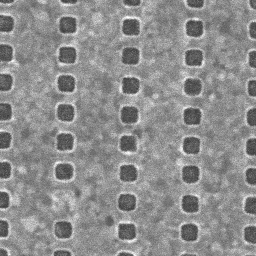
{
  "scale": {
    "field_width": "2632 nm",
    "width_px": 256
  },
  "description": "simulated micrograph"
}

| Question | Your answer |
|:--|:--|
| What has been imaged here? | a regular array of holes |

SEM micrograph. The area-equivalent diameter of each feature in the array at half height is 20.1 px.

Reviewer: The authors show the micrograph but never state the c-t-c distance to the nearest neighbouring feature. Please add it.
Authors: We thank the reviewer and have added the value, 298 nanometers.